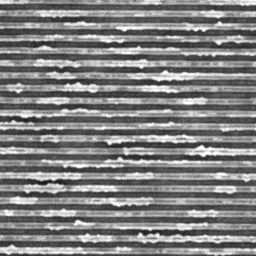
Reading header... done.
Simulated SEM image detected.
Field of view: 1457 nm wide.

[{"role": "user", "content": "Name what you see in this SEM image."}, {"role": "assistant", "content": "parallel lines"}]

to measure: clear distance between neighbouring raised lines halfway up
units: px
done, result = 7.12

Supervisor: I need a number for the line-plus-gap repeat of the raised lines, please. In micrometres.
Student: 0.0711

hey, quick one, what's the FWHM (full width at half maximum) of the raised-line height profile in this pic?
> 30.6 nm